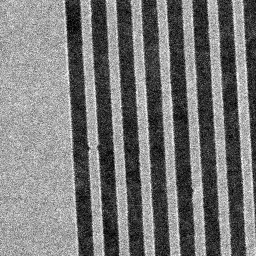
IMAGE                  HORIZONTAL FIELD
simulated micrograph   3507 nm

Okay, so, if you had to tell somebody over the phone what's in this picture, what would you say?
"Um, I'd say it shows parallel lines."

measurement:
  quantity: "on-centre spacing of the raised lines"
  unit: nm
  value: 348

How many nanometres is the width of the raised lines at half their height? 125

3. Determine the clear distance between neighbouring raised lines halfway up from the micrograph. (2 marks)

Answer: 0.226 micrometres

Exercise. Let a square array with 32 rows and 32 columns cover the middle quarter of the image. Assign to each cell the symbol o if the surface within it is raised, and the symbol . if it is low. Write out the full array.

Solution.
o....oo.....oo....oo....oo.....o
o....oo.....oo....oo....oo.....o
o....oo.....oo....oo....oo.....o
o....oo.....oo....oo....oo.....o
o....oo.....oo....oo....oo.....o
o....ooo....oo....oo.....oo....o
o....ooo....oo....oo.....oo....o
o.....oo....oo....oo.....oo....o
o.....oo....oo....oo.....oo....o
o.....oo....oo....oo.....oo....o
o.....oo....oo....oo.....oo....o
o.....oo....oo....ooo....oo....o
o.....oo....oo.....oo....oo....o
oo....oo....oo.....oo....oo....o
oo....oo....oo.....oo....oo....o
oo....oo....oo.....oo....oo....o
oo....oo....ooo....oo....oo....o
oo....oo....ooo....oo....oo....o
oo....oo.....oo....oo....oo.....
oo....oo.....oo....oo....oo.....
oo....oo.....oo....oo....oo.....
oo.....o.....oo....oo....oo.....
oo....oo.....oo....oo....oo.....
oo....oo.....oo....oo.....o.....
oo....ooo....oo....oo.....oo....
oo.....oo....oo....oo.....oo....
oo.....oo....oo....oo.....oo....
oo.....oo....oo....oo.....oo....
oo.....oo....oo....oo.....oo....
oo.....oo....oo....ooo....oo....
oo.....oo....oo....ooo....oo....
ooo....oo....oo.....oo....oo....